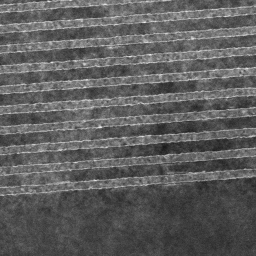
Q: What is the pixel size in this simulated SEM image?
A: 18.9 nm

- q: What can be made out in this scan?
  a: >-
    parallel lines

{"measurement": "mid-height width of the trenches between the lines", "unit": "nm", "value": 235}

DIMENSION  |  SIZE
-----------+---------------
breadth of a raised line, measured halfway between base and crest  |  7.86 px